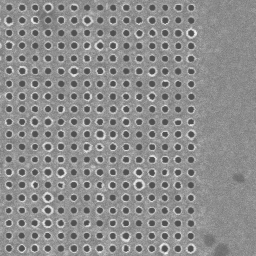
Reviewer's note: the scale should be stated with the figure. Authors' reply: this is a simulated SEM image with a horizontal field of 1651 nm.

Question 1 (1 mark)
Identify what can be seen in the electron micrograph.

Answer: a regular array of holes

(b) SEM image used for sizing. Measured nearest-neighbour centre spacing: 79.4 nm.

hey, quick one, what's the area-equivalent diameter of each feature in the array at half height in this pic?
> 39.5 nm